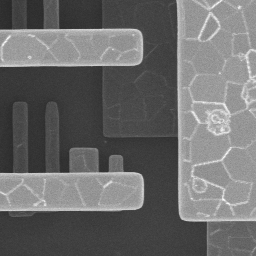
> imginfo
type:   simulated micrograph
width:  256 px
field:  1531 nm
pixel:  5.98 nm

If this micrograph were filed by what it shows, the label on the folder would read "wiring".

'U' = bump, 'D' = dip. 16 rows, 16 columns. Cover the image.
DDDDDDDDDDDUUUUU
DDDDDDDDDDDUUUUU
UUUUUUUUUDDUUUUU
UUUUUUUUUDDUUUUU
DDDDDDDDDDDUUUUU
DDDDDDDDDDDUUUUU
DDDDDDDDDDDUUUUU
DDDDDDDDDDDUUUUU
DDDDDDDDDDDUUUUU
DDDDDDDDDDDUUUUU
DDDDDDDDDDDUUUUU
UUUUUUUUUDDUUUUU
UUUUUUUUUDDUUUUU
DDDDDDDDDDDUUUUU
DDDDDDDDDDDDDDDD
DDDDDDDDDDDDDDDD